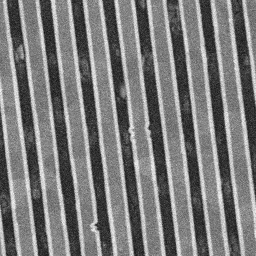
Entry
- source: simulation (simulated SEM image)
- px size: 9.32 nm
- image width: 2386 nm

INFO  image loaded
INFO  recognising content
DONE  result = parallel lines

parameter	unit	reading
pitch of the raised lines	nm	295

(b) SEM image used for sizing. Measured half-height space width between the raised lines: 141 nanometres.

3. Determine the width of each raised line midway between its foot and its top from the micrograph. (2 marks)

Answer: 157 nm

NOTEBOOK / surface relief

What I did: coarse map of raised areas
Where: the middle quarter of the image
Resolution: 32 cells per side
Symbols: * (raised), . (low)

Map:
***....****....****....****....*
***....****....****....****....*
***....*****...****....****....*
****....****....***....*****...*
****....****....****....****....
****....****....****....****....
****....****....****....****....
****....****....****....****....
****....****....****....****....
****....****....****....****....
****....****....****....****....
*****....****....***....*****...
.****....****....****....****...
.****....****....****....****...
.****....****....****....****...
.****....****....****....****...
.****....****....****....****...
.*****...****....****....****...
.*****...****....****....*****..
.*****...*****...****....*****..
..****...*****...*****...*****..
..****....****....****....****..
..****....****....****....****..
..****....****....****....****..
..****....****....****....****..
..****....****....****....****..
..****....****....****....*****.
...***....*****...*****...*****.
...****....****...*****...*****.
...****....****....****....****.
...****....****....****....****.
...****....****....****....****.